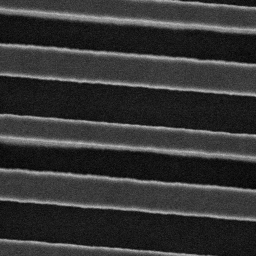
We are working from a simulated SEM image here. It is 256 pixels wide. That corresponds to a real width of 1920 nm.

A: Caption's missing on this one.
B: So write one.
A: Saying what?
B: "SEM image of lines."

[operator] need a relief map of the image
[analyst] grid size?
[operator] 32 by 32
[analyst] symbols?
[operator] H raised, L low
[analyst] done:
HHHHHHHHHHHHHHHHHHHHHHHHHHHLLLLL
LLLHHHHHHHHHHHHHHHHHHHHHHHHHHHHH
LLLLLLLLLLLLLLLHHHHHHHHHHHHHHHHH
LLLLLLLLLLLLLLLLLLLLLLLLLLLHHHHH
LLLLLLLLLLLLLLLLLLLLLLLLLLLLLLLL
LLLLLLLLLLLLLLLLLLLLLLLLLLLLLLLL
HHHHHHHHHHHHLLLLLLLLLLLLLLLLLLLL
HHHHHHHHHHHHHHHHHHHHHHHHLLLLLLLL
HHHHHHHHHHHHHHHHHHHHHHHHHHHHHHHH
LLHHHHHHHHHHHHHHHHHHHHHHHHHHHHHH
LLLLLLLLLLLLLLHHHHHHHHHHHHHHHHHH
LLLLLLLLLLLLLLLLLLLLLLLLLLHHHHHH
LLLLLLLLLLLLLLLLLLLLLLLLLLLLLLLL
LLLLLLLLLLLLLLLLLLLLLLLLLLLLLLLL
HHHLLLLLLLLLLLLLLLLLLLLLLLLLLLLL
HHHHHHHHHHHHHHHLLLLLLLLLLLLLLLLL
HHHHHHHHHHHHHHHHHHHHHHHHHHHLLLLL
LLLHHHHHHHHHHHHHHHHHHHHHHHHHHHHH
LLLLLLLLLLLLLLLLHHHHHHHHHHHHHHHH
LLLLLLLLLLLLLLLLLLLLLLLLLLLLHHHH
LLLLLLLLLLLLLLLLLLLLLLLLLLLLLLLL
HHHHLLLLLLLLLLLLLLLLLLLLLLLLLLLL
HHHHHHHHHHHHHHHHHLLLLLLLLLLLLLLL
HHHHHHHHHHHHHHHHHHHHHHHHHHHHLLLL
HHHHHHHHHHHHHHHHHHHHHHHHHHHHHHHH
LLLLLLLHHHHHHHHHHHHHHHHHHHHHHHHH
LLLLLLLLLLLLLLLLLLLLHHHHHHHHHHHH
LLLLLLLLLLLLLLLLLLLLLLLLLLLLLLLL
LLLLLLLLLLLLLLLLLLLLLLLLLLLLLLLL
LLLLLLLLLLLLLLLLLLLLLLLLLLLLLLLL
HHHHHHHHLLLLLLLLLLLLLLLLLLLLLLLL
HHHHHHHHHHHHHHHHHHHHLLLLLLLLLLLL